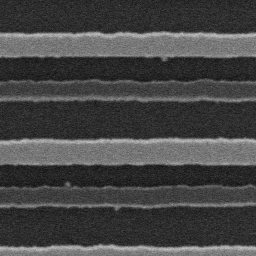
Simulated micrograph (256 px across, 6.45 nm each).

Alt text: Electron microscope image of lines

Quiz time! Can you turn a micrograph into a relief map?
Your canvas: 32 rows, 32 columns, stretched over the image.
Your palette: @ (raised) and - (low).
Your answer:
--------------------------------
--------------------------------
--------------------------------
--------------------------------
@@@@@@@@@@@@@@@@@@@@@@@@@@@@@@@@
@@@@@@@@@@@@@@@@@@@@@@@@@@@@@@@@
@@@@@@@@@@@@@@@@@@@@@@@@@@@@@@@@
--------------------------------
--------------------------------
--------------------------------
@@@@@@@@@@@@@@@@@@@@@@@@@@@@@@@@
@@@@@@@@@@@@@@@@@@@@@@@@@@@@@@@@
----------------------@@---@@@@-
--------------------------------
--------------------------------
--------------------------------
--------------------------------
--------------------------------
@@@@@@@@@@@@@@@@@@@@@@@@@@@@@@@@
@@@@@@@@@@@@@@@@@@@@@@@@@@@@@@@@
@@@@@@@@@-@@@@@@@@--@@@--@@@@@@@
--------------------------------
--------------------------------
@@@@@@@@@@@@@@@@@@@@@@@@@@@@@@@@
@@@@@@@@@@@@@@@@@@@@@@@@@@@@@@@@
@@@@@@@@@@@@@@@@@@@@@@@@@@@@@@@@
--------------------------------
--------------------------------
--------------------------------
--------------------------------
--------------------------------
@@@@@@@@@@@@@@@@@@@@@@@@@@@@@@@@